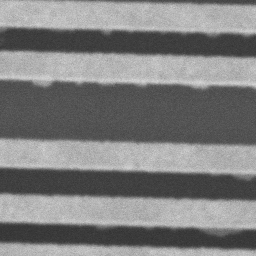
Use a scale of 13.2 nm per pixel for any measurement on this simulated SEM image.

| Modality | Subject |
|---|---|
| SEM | lines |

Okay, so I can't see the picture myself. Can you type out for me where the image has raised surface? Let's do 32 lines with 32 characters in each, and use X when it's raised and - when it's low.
XXXXXXXXXXXXXXXXXXXXXXXX--------
XXXXXXXXXXXXXXXXXXXXXXXXXXXXXXXX
XXXXXXXXXXXXXXXXXXXXXXXXXXXXXXXX
--------XXXXXXXXXXXXXXXXXXXXXXXX
--------------------------------
--------------------------------
X-------------------------------
XXXXXXXXXXXXXXXXXXXXXXXXXXXXXXXX
XXXXXXXXXXXXXXXXXXXXXXXXXXXXXXXX
XXXXXXXXXXXXXXXXXXXXXXXXXXXXXXXX
----------------------XXXXXXXXXX
--------------------------------
--------------------------------
--------------------------------
--------------------------------
--------------------------------
--------------------------------
X-------------------------------
XXXXXXXXXXXXXXXXXXXXXXXXXXXXXXXX
XXXXXXXXXXXXXXXXXXXXXXXXXXXXXXXX
XXXXXXXXXXXXXXXXXXXXXXXXXXXXXXXX
----------------------XXXXXXXXXX
--------------------------------
--------------------------------
XXXXXXXX------------------------
XXXXXXXXXXXXXXXXXXXXXXXXXXXXXXXX
XXXXXXXXXXXXXXXXXXXXXXXXXXXXXXXX
XXXXXXXXXXXXXXXXXXXXXXXXXXXXXXXX
---------------------------XXXXX
--------------------------------
XXXX----------------------------
XXXXXXXXXXXXXXXXXXXXXXXXXXXXXXXX